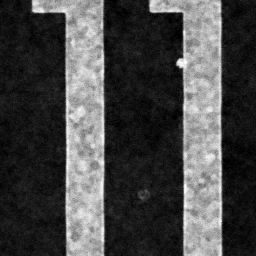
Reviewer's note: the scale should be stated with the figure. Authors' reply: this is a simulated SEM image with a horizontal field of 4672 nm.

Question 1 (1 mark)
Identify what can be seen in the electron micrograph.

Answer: wiring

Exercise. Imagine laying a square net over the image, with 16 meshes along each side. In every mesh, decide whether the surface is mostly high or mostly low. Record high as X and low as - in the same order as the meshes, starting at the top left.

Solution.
--XXXX----XXXX--
----XX------XX--
----XX------XX--
----XX-----XXX--
----XX-----XXX--
----XX------XX--
----XX------XX--
----XX------XX--
----XX------XX--
----XX------XX--
----XX------XX--
----XX------XX--
----XX------XX--
----XX------XX--
----XX------XX--
----XX------XX--